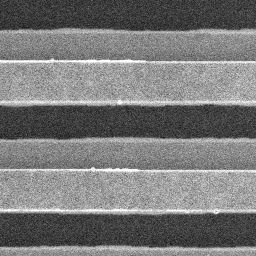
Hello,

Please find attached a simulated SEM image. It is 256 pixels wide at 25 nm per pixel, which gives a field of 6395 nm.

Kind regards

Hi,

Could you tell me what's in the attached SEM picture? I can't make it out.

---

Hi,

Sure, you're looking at lines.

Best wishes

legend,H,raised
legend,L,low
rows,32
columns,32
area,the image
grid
LLLLLLLLLLLLLLLLLLLLLLLLLLLLLLLL
LLLLLLLLLLLLLLLLLLLLLLLLLLLLLLLL
LLLLLLLLLLLLLLLLLLLLLLLLLLLLLLLL
LLLLLLLLLLLLLLLLLLLLLLLLLLLLLLLL
HHHHHHHHHHHHHHHHHHHHHHHHHHHHHHHH
HHHHHHHHHHHHHHHHHHHHHHHHHHHHHHHH
HHHHHHHHHHHHHHHHHHHHHHHHHHHHHHHH
HHHHHHHHHHHHHHHHHHHHHHHHHHHHHHHH
HHHHHHHHHHHHHHHHHHHHHHHHHHHHHHHH
HHHHHHHHHHHHHHHHHHHHHHHHHHHHHHHH
HHHHHHHHHHHHHHHHHHHHHHHHHHHHHHHH
HHHHHHHHHHHHHHHHHHHHHHHHHHHHHHHH
HHHHHHHHHHHHHHHHHHHHHHHHHHHHHHHH
LLLLLLLLLLLLLLLLLLLLLLLLLLLLLLLL
LLLLLLLLLLLLLLLLLLLLLLLLLLLLLLLL
LLLLLLLLLLLLLLLLLLLLLLLLLLLLLLLL
LLLLLLLLLLLLLLLLLLLLLLLLLLLLLLLL
LLLLLLLLLLLLLLLLLLLLLLLLLLLLLLLL
HHHHHHHHHHHHHHHHHHHHHHHHHHHHHHHH
HHHHHHHHHHHHHHHHHHHHHHHHHHHHHHHH
HHHHHHHHHHHHHHHHHHHHHHHHHHHHHHHH
HHHHHHHHHHHHHHHHHHHHHHHHHHHHHHHH
HHHHHHHHHHHHHHHHHHHHHHHHHHHHHHHH
HHHHHHHHHHHHHHHHHHHHHHHHHHHHHHHH
HHHHHHHHHHHHHHHHHHHHHHHHHHHHHHHH
HHHHHHHHHHHHHHHHHHHHHHHHHHHHHHHH
LLLLLLLLLLLLLLLLLLLLLLLLLLLLLLLL
LLLLLLLLLLLLLLLLLLLLLLLLLLLLLLLL
LLLLLLLLLLLLLLLLLLLLLLLLLLLLLLLL
LLLLLLLLLLLLLLLLLLLLLLLLLLLLLLLL
LLLLLLLLLLLLLLLLLLLLLLLLLLLLLLLL
HHHHHHHHHHHHHHHHHHHHHHHHHHHHHHHH